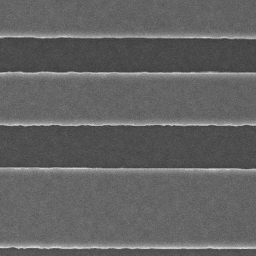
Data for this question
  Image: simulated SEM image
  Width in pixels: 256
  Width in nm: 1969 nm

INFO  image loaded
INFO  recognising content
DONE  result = lines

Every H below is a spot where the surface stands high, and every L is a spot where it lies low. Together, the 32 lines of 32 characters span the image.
HHHHHHHHHHHHHHHHHHHHHHHHHHHHHHHH
HHHHHHHHHHHHHHHHHHHHHHHHHHHHHHHH
HHHHHHHHHHHHHHHHHHHHHHHHHHHHHHHH
HHHHHHHHHHHHHHHHHHHHHHHHHHHHHHHH
HHHHHHHHHHHHHHHHHHHHHHHHHHHHHHHH
LLLLLLLLLLLLLLLLLLLLLLLLLLLLLLLL
LLLLLLLLLLLLLLLLLLLLLLLLLLLLLLLL
LLLLLLLLLLLLLLLLLLLLLLLLLLLLLLLL
LLLLLLLLLLLLLLLLLLLLLLLLLLLLLLLL
HHHHHHHHHHHHHHHHHHHHHHHHHHHHHHHH
HHHHHHHHHHHHHHHHHHHHHHHHHHHHHHHH
HHHHHHHHHHHHHHHHHHHHHHHHHHHHHHHH
HHHHHHHHHHHHHHHHHHHHHHHHHHHHHHHH
HHHHHHHHHHHHHHHHHHHHHHHHHHHHHHHH
HHHHHHHHHHHHHHHHHHHHHHHHHHHHHHHH
HHHHHHHHHHHHHHHHHHHHHHHHHHHHHHHH
LLLLLLLLLLLLLLLLLLLLLLLLLLLLLLLL
LLLLLLLLLLLLLLLLLLLLLLLLLLLLLLLL
LLLLLLLLLLLLLLLLLLLLLLLLLLLLLLLL
LLLLLLLLLLLLLLLLLLLLLLLLLLLLLLLL
LLLLLLLLLLLLLLLLLLLLLLLLLLLLLLLL
HHHHHHHHHHHHHHHHHHHHHHHHHHHHHHHH
HHHHHHHHHHHHHHHHHHHHHHHHHHHHHHHH
HHHHHHHHHHHHHHHHHHHHHHHHHHHHHHHH
HHHHHHHHHHHHHHHHHHHHHHHHHHHHHHHH
HHHHHHHHHHHHHHHHHHHHHHHHHHHHHHHH
HHHHHHHHHHHHHHHHHHHHHHHHHHHHHHHH
HHHHHHHHHHHHHHHHHHHHHHHHHHHHHHHH
HHHHHHHHHHHHHHHHHHHHHHHHHHHHHHHH
HHHHHHHHHHHHHHHHHHHHHHHHHHHHHHHH
HHHHHHHHHHHHHHHHHHHHHHHHHHHHHHHH
LLLLLLLLLLLLLLLLLLLLLLLLLLLLLLLL